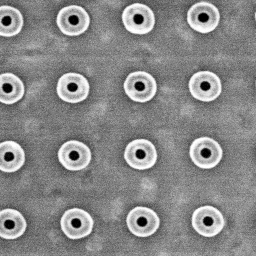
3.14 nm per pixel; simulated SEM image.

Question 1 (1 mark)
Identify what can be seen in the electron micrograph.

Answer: a regular array of ring-shaped raised bodies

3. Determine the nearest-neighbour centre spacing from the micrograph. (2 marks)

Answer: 0.205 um